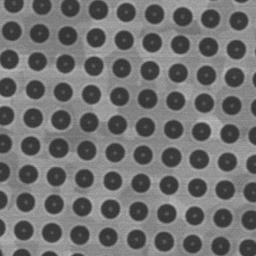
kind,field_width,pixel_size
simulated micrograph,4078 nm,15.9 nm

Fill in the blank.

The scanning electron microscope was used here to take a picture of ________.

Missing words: an array of small figures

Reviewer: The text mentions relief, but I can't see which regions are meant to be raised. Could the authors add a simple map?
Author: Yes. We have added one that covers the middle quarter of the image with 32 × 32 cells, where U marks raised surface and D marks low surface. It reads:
DDDUUDDDDDUUDDDDDUUDDDDDUUUDDDUU
DDUUUDDDDDUUDDDDDUUDDDDDUUDDDDDU
DUUUUUDDDUUUDDDDDUUDDDDDUUDDDDDU
UUUUUUUUUUUUUUDDUUUUDDDUUUDDDDDU
UUUUUUUUUUUUUUUUUUUUUUUUUUUDDDUU
DDUUUDDDUUUUUUUUUUUUUUUUUUUUUUUU
DDUUUDDDDUUUDDDDUUUUDDUUUUUUUUUU
DDUUDDDDDUUDDDDDUUUDDDDUUUDDDDUU
DDUUDDDDDUUDDDDDDUDDDDDDUDDDDDUU
DUUUUDDDDUUUDDDDUUDDDDDUUDDDDDUU
UUUUUUUUUUUUUDDUUUUDDDDUUUDDDDUU
UUUUUUUUUUUUUUUUUUUUUUUUUUUDDUUU
DUUUUDDDUUUUUUUUUUUUUUUUUUUUUUUU
DDUUDDDDDUUDDDDUUUUDDDUUUUUUUUUU
DDUUDDDDDUUDDDDDUUDDDDDUUDDDDUUU
DDUUDDDDDUUDDDDDUUDDDDDUUDDDDDUU
DUUUUDDDUUUDDDDDUUDDDDDUUDDDDDUU
UUUUUUUUUUUUDDDUUUDDDDUUUDDDDDUU
UUUUUUUUUUUUUUUUUUUUUUUUUUDDDUUU
DUUUDDDUUUUUDUUUUUUUUUUUUUUUUUUU
DUUDDDDDUUUDDDDUUUDDDUUUUUUUUUUU
DUUDDDDDUUDDDDDUUUDDDDUUUDDDDUUU
DUUDDDDDUUDDDDDUUDDDDDUUDDDDDUUU
UUUUDDDDUUDDDDDUUDDDDDUUDDDDDDUD
UUUUUUUUUUUDDDUUUUDDDDUUDDDDDUUD
UUUUUUUUUUUUUUUUUUUUUUUUUDDDUUUU
UUUUDDDUUUUUUUUUUUUUUUUUUUUUUUUU
DUUDDDDDUUDDDDUUUUDDUUUUUUUUUUUU
DUUDDDDDUUDDDDDUUDDDDUUUUDDDUUUU
UUUDDDDDUUDDDDDUUDDDDDUUDDDDDUUD
UUUDDDDUUUDDDDDUUDDDDDUUDDDDDUUD
UUUUUUUUUUUDDUUUUDDDDUUUDDDDUUUD